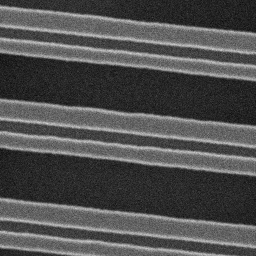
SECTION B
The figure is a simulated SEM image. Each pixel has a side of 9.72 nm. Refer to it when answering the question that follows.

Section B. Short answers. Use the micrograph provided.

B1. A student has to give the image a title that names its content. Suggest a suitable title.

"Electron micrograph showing lines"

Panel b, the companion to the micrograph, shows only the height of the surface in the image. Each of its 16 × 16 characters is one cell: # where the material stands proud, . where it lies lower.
#...............
##########......
################
..##############
...........#####
................
###.............
############....
################
...#############
............####
................
#...............
##########......
################
################